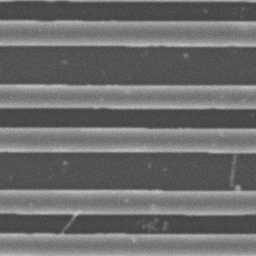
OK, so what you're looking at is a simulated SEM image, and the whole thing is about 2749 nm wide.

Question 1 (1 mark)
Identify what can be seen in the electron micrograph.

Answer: lines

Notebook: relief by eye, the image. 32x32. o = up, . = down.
................................
................................
................................
oooooooooooooooooooooooooooooooo
oooooooooooooooooooooooooooooooo
oooooooooooooooooooooooooooooooo
................................
................................
................................
................................
................................
oooooooooooooooooooooooooooooooo
oooooooooooooooooooooooooooooooo
.............ooooooooooooooooooo
................................
................................
oooooooooooooooooooooooooooooooo
oooooooooooooooooooooooooooooooo
oooooooooooooooooooooooooooooooo
................................
................................
................................
................................
................................
oooooooooooooooooooooooooooooooo
oooooooooooooooooooooooooooooooo
oooooooooooooooooooooooooooooooo
................................
................................
oooooooooooooooooooooooooooooooo
oooooooooooooooooooooooooooooooo
oooooooooooooooooooooooooooooooo